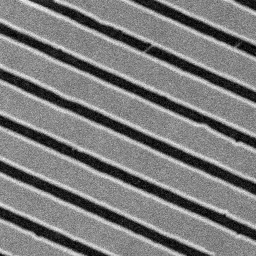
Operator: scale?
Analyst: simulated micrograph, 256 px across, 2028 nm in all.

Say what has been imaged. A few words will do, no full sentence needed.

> parallel lines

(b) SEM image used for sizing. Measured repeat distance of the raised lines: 0.332 µm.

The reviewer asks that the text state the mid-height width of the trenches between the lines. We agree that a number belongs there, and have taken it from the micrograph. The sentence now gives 99.2 nanometres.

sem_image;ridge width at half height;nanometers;234